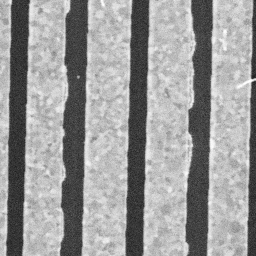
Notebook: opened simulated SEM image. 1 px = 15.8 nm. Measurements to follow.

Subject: lines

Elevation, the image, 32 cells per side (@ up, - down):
@---@@@@---@@@@@---@@@@@---@@@@@
@---@@@@---@@@@@---@@@@@---@@@@@
@---@@@@---@@@@@---@@@@@---@@@@-
@---@@@@---@@@@@---@@@@@---@@@@-
@---@@@@---@@@@@---@@@@@---@@@@-
@---@@@@---@@@@@---@@@@@---@@@@-
@---@@@@---@@@@@---@@@@@---@@@@-
@---@@@@---@@@@@---@@@@@---@@@@-
@---@@@@---@@@@@---@@@@@---@@@@-
@---@@@@---@@@@@---@@@@@---@@@@-
@--@@@@@---@@@@@---@@@@@---@@@@-
@--@@@@@---@@@@@--@@@@@@--@@@@@-
@--@@@@@---@@@@@--@@@@@@--@@@@@-
@--@@@@@---@@@@@--@@@@@---@@@@@-
@--@@@@@---@@@@@--@@@@@---@@@@@-
@--@@@@@---@@@@@--@@@@@---@@@@@-
@--@@@@@---@@@@@--@@@@@---@@@@@-
@--@@@@@---@@@@@--@@@@@---@@@@@-
@--@@@@@---@@@@@--@@@@@---@@@@@-
@--@@@@@---@@@@@--@@@@@---@@@@@-
@--@@@@@---@@@@@--@@@@@---@@@@@-
@--@@@@@---@@@@@--@@@@@---@@@@@-
@--@@@@@---@@@@@--@@@@@---@@@@@-
@--@@@@@---@@@@@--@@@@@---@@@@@-
@--@@@@@---@@@@@--@@@@@---@@@@@-
@--@@@@@---@@@@@--@@@@@---@@@@@-
@--@@@@@---@@@@@--@@@@@---@@@@@-
@--@@@@@---@@@@@--@@@@@---@@@@@-
@--@@@@@---@@@@@--@@@@@---@@@@@-
@--@@@@@--@@@@@@--@@@@@---@@@@@-
@--@@@@@--@@@@@@--@@@@@---@@@@@-
@--@@@@---@@@@@@--@@@@@---@@@@@-